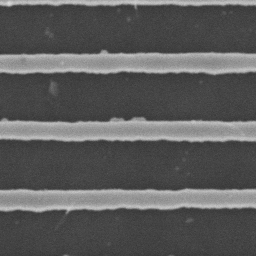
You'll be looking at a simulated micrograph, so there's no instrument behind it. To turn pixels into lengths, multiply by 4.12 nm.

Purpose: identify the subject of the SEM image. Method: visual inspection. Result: lines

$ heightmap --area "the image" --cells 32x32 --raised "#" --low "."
########..#####.################
................................
................................
................................
................................
................................
................................
################################
################################
................................
................................
................................
................................
................................
................................
################################
################################
...#...#############.###########
................................
................................
................................
................................
................................
................................
################################
################################
................................
................................
................................
................................
................................
................................